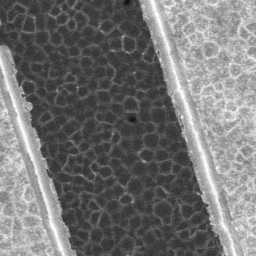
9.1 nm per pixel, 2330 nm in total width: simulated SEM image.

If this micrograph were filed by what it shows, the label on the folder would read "one or a few lines or trenches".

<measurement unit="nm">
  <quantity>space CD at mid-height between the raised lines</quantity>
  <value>1490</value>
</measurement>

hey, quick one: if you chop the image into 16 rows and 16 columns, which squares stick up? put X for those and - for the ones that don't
----------XXXXXX
----------XXXXXX
----------XXXXXX
-----------XXXXX
-----------XXXXX
X----------XXXXX
X-----------XXXX
X-----------XXXX
XX----------XXXX
XX-----------XXX
XX-----------XXX
XXX----------XXX
XXX-----------XX
XXX-----------XX
XXX-----------XX
XXXX-----------X